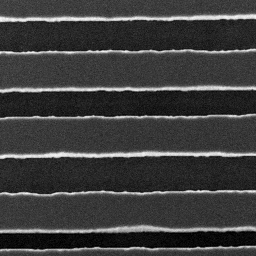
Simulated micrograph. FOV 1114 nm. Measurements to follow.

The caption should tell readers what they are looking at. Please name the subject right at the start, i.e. lines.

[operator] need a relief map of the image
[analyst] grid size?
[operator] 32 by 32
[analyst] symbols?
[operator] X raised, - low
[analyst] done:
XXXXXXXXXXXXXXXXXXXXXXXXXXXXXXXX
XXXXXXXXXXXXXXXXXXXXXXXXXXXXXXXX
XXXX-XXX-----X------------------
--------------------------------
--------------------------------
--------------------------------
------X----XXXXXXXXXXXXXXXXXXXXX
XXXXXXXXXXXXXXXXXXXXXXXXXXXXXXXX
XXXXXXXXXXXXXXXXXXXXXXXXXXXXXXXX
XXXXXXXXXXXXXXXXXXXXXXXXXXXXXXXX
XXXXXXXXXXXXXXXXXXXXXXXXXXXXXXXX
--------------------------------
--------------------------------
--------------------------------
--------------------------XXXXXX
XXXXXXXXXXXXXXXXXXXXXXXXXXXXXXXX
XXXXXXXXXXXXXXXXXXXXXXXXXXXXXXXX
XXXXXXXXXXXXXXXXXXXXXXXXXXXXXXXX
XXXXXXXXXXXXXXXXXXXXXXXXXXXXXXXX
XXXXXXX---XXX-------------------
--------------------------------
--------------------------------
--------------------------------
--------------------------------
XXXXXXXXXXXXXXXXXXXXXXXXXXXXXXXX
XXXXXXXXXXXXXXXXXXXXXXXXXXXXXXXX
XXXXXXXXXXXXXXXXXXXXXXXXXXXXXXXX
XXXXXXXXXXXXXXXXXXXXXXXXXXXXXXXX
XXXXXXXXXXXXXXXXXXXXXXXXXXXXXXXX
--------------------------------
--------------------------------
XXXXXXXXXXXXXXXXXXXXXXXXXXXXXXXX